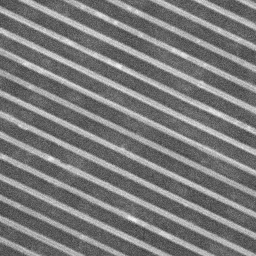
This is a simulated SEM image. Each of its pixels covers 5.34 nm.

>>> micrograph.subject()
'parallel lines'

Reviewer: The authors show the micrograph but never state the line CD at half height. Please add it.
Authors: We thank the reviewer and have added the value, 22.8 nm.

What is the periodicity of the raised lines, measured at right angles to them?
101 nm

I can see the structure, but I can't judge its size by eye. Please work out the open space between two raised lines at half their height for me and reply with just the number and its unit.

77.5 nanometers